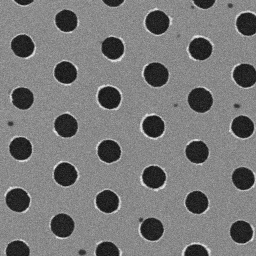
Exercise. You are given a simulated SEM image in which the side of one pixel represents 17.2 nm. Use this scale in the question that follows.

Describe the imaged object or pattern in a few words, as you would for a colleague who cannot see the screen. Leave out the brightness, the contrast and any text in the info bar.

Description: a regular array of holes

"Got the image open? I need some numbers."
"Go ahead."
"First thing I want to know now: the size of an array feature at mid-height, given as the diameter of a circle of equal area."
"0.403 µm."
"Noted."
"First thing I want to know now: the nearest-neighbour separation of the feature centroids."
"50.3 pixels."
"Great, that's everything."